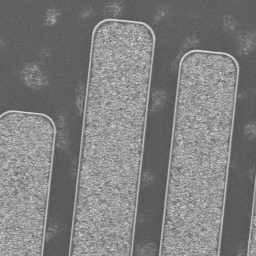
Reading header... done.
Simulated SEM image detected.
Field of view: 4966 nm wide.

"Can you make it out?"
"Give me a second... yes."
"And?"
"one or a few lines or trenches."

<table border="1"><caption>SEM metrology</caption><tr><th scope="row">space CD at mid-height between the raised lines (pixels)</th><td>28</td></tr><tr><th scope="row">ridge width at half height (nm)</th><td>1180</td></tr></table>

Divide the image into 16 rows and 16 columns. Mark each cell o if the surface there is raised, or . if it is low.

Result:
................
......ooo.......
......oooo......
......oooo..oo..
......ooo..oooo.
.....oooo..oooo.
.....oooo..oooo.
ooo..oooo..oooo.
ooo..oooo..ooo..
ooo..oooo..ooo..
ooo..oooo..ooo..
ooo..oooo.oooo..
ooo..oooo.oooo..
ooo..ooo..oooo..
ooo.oooo..oooo..
ooo.oooo..oooo..